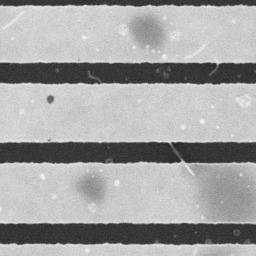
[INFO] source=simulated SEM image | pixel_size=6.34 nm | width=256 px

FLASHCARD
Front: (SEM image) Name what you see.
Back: lines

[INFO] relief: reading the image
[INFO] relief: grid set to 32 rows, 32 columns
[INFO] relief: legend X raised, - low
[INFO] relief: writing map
--------------------------------
XXXXXXXXXXXXXXXXXXXXXXXXXXXXXXXX
XXXXXXXXXXXXXXXXXXXXXXXXXXXXXXXX
XXXXXXXXXXXXXXXXXXXXXXXXXXXXXXXX
XXXXXXXXXXXXXXXXXXXXXXXXXXXXXXXX
XXXXXXXXXXXXXXXXXXXXXXXXXXXXXXXX
XXXXXXXXXXXXXXXXXXXXXXXXXXXXXXXX
XXXXXXXXXXXXXXXXXXXXXXXXXXXXXXXX
--------------------------------
--------------------------------
XXXXX-X-XXX--XX-XXXXXXXX---XXXXX
XXXXXXXXXXXXXXXXXXXXXXXXXXXXXXXX
XXXXXXXXXXXXXXXXXXXXXXXXXXXXXXXX
XXXXXXXXXXXXXXXXXXXXXXXXXXXXXXXX
XXXXXXXXXXXXXXXXXXXXXXXXXXXXXXXX
XXXXXXXXXXXXXXXXXXXXXXXXXXXXXXXX
XXXXXXXXXXXXXXXXXXXXXXXXXXXXXXXX
XXXXXXXXXXXXXXXXXXXXXXXXXXXXXXXX
--------------------------------
--------------------------------
XXXXXXXXXXXXXXXXXXXXXXXXXXXXXXXX
XXXXXXXXXXXXXXXXXXXXXXXXXXXXXXXX
XXXXXXXXXXXXXXXXXXXXXXXXXXXXXXXX
XXXXXXXXXXXXXXXXXXXXXXXXXXXXXXXX
XXXXXXXXXXXXXXXXXXXXXXXXXXXXXXXX
XXXXXXXXXXXXXXXXXXXXXXXXXXXXXXXX
XXXXXXXXXXXXXXXXXXXXXXXXXXXXXXXX
XXXXXXXXXXXXXXXXXXXXXXXXXXXXXXXX
--------------------------------
--------------------------------
-------------XX-----------------
XXXXXXXXXXXXXXXXXXXXXXXXXXXXXXXX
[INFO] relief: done